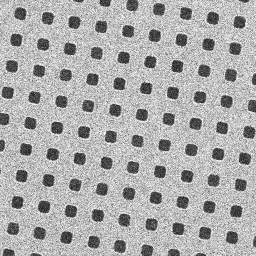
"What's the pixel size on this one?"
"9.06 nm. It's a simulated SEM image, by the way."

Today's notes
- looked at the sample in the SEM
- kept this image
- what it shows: a regular array of holes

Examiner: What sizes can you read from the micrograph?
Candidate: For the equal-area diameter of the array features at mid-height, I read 0.118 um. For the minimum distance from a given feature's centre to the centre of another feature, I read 26.6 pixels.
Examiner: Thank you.